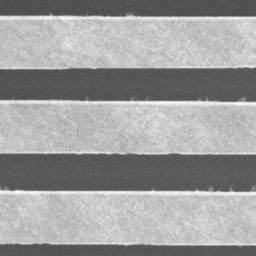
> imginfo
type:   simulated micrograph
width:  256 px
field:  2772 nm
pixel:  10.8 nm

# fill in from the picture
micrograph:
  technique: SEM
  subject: lines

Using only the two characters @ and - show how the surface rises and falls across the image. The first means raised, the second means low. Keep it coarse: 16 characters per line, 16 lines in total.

----------------
@@@@@@@@@@@@@@@@
@@@@@@@@@@@@@@@@
@@@@@@@@@@@@@@@@
----------------
----------------
@@@@@@@@@@@@@@@@
@@@@@@@@@@@@@@@@
@@@@@@@@@@@@@@@@
@@@@@@@@@@@@@@@@
----------------
----------------
@@@@@@@@@@@@@@@@
@@@@@@@@@@@@@@@@
@@@@@@@@@@@@@@@@
----------------